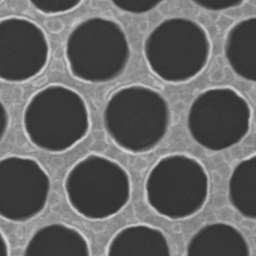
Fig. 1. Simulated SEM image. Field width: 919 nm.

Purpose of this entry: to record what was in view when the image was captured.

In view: holes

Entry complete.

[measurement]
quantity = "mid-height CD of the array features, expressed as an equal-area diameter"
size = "221 nm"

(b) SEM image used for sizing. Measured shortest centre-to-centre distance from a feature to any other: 284 nm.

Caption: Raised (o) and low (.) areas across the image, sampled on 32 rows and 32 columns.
oooo......oooo......ooooo.....oo
oooooo.ooooooooo..oooooooooooooo
o..oooooooo..oooooooo...ooooooo.
.....oooo......ooooo.....oooo...
.....oooo.......ooo.......ooo...
......oo........oo........oo....
......oo........oo........oo....
......ooo.......ooo.......ooo...
.....oooo......oooo......oooo...
....oooooo....oooooo....oooooo..
oooooooooooooooooooooooooooooooo
ooooo....oooooo....ooooooo...ooo
oooo......oooo......oooo......oo
ooo........oo........ooo.......o
.oo........oo........ooo.......o
.oo........oo........ooo.......o
ooo........ooo.......ooo.......o
oooo......oooo......oooo......oo
oooooo..oooooooo...ooooooo..oooo
oooooooooooooooooooooooooooooooo
.....ooooo....oooooo.....ooooo..
.....oooo......oooo......oooo...
......oo........oo........ooo...
......oo........oo........ooo...
......ooo.......oo........ooo...
......ooo.......ooo......oooo...
.....ooooo....oooooo....oooooo..
o..ooooooooooooooooooooooooooooo
oooooo..oooooooo...oooooo....ooo
oooo......ooooo.....oooo......oo
.ooo.......ooo.......ooo.......o
.oo........ooo.......oo........o